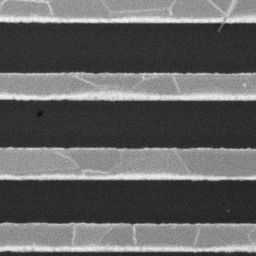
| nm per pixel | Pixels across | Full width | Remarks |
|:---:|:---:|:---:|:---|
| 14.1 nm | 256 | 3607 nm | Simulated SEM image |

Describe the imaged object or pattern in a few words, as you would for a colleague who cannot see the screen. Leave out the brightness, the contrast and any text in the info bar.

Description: lines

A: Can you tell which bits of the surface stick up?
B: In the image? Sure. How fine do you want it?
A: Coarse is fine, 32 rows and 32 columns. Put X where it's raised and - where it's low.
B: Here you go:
XXXXXXXXXXXXXXXXXXXXXXXXXXXXXXXX
XXXXXXXXXXXXXXXXXXXXXXXXXXXXXXXX
XXXXXXXXXXXXXXXXXXXXXXXXXXXXXXXX
--------------------------------
--------------------------------
--------------------------------
--------------------------------
--------------------------------
--------------------------------
XXXXXXXXXXXXXXXXXXXXXXXXXXXXXXXX
XXXXXXXXXXXXXXXXXXXXXXXXXXXXXXXX
XXXXXXXXXXXXXXXXXXXXXXXXXXXXXXXX
--------------------------------
--------------------------------
--------------------------------
--------------------------------
--------------------------------
--------------------------------
-X------------------------------
XXXXXXXXXXXXXXXXXXXXXXXXXXXXXXXX
XXXXXXXXXXXXXXXXXXXXXXXXXXXXXXXX
XXXXXXXXXXXXXXXXXXXXXXXXXXXXXXXX
--------------------------------
--------------------------------
--------------------------------
--------------------------------
--------------------------------
--------------------------------
XXXXXXXXXXXXXXXXXXXXXXXXXXXXXXXX
XXXXXXXXXXXXXXXXXXXXXXXXXXXXXXXX
XXXXXXXXXXXXXXXXXXXXXXXXXXXXXXXX
--------------------------------